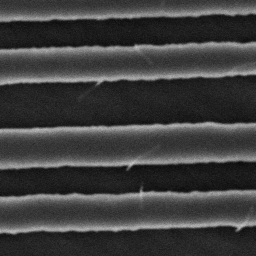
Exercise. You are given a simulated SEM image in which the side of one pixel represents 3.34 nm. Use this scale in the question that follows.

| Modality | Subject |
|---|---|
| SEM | lines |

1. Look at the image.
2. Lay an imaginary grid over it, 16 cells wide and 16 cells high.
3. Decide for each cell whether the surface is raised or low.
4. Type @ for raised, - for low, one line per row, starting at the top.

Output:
@@@@@@@@@@@@@@@@
----------------
----------------
@@@@@@@@@@@@@@@@
@@@@@@@@@@@@@@@@
----------------
----------------
----------------
@@@@@@@@@@@@@@@@
@@@@@@@@@@@@@@@@
@---------------
----------------
@@@@@@@@@@@@@@@@
@@@@@@@@@@@@@@@@
@@--------------
----------------